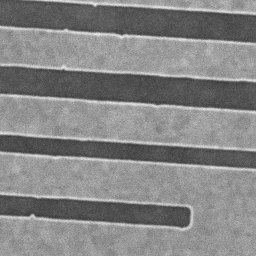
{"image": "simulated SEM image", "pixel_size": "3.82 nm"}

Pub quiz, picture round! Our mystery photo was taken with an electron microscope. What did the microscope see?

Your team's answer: parallel lines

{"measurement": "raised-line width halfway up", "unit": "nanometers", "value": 148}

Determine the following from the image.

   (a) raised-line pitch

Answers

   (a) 0.247 um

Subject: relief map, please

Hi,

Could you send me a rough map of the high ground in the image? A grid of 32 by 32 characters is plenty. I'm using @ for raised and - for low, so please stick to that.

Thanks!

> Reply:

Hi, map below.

-----------@-@@@@@@@@@@@@@@@@@@@
----------------------------@@@@
--------------------------------
@@------------------------------
@@@@@@@@@@@@@@@@----------------
@@@@@@@@@@@@@@@@@@@@@@@@@@@@@@@@
@@@@@@@@@@@@@@@@@@@@@@@@@@@@@@@@
@@@@@@@@@@@@@@@@@@@@@@@@@@@@@@@@
-------@@@@@@@@@@@@@@@@@@@@@@@@@
----------------------@@@@@@@@@@
--------------------------------
--------------------------------
@@@@@@@@@-----------------------
@@@@@@@@@@@@@@@@@@@@@@@@--------
@@@@@@@@@@@@@@@@@@@@@@@@@@@@@@@@
@@@@@@@@@@@@@@@@@@@@@@@@@@@@@@@@
@@@@@@@@@@@@@@@@@@@@@@@@@@@@@@@@
-------------@@@@@@@@@@@@@@@@@@@
----------------------------@@@@
@@@@@@--------------------------
@@@@@@@@@@@@@@@@@@@@@-----------
@@@@@@@@@@@@@@@@@@@@@@@@@@@@@@@@
@@@@@@@@@@@@@@@@@@@@@@@@@@@@@@@@
@@@@@@@@@@@@@@@@@@@@@@@@@@@@@@@@
----@@@@@@@@@@@@@@@@@@@@@@@@@@@@
--------------------@@@@@@@@@@@@
------------------------@@@@@@@@
@@@@@@@-----------------@@@@@@@@
@@@@@@@@@@@@@@@@@@@@@@-@@@@@@@@@
@@@@@@@@@@@@@@@@@@@@@@@@@@@@@@@@
@@@@@@@@@@@@@@@@@@@@@@@@@@@@@@@@
@@@@@@@@@@@@@@@@@@@@@@@@@@@@@@@@